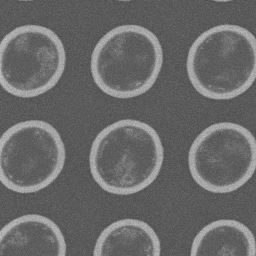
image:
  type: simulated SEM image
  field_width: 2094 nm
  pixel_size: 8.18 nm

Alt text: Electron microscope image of raised bodies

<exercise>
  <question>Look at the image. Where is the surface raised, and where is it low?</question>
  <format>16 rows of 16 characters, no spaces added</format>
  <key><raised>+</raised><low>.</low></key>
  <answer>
................
................
+++....+++...+++
++++..++++..++++
++++..++++..++++
.++....++....++.
................
................
+++...++++...++.
++++..++++..++++
++++..++++..++++
.++...+++....++.
................
................
++++...++....++.
++++..++++..++++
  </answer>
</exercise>